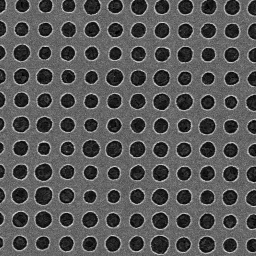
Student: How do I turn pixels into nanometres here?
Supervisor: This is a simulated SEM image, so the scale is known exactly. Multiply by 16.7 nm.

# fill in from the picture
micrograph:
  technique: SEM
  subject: a regular array of holes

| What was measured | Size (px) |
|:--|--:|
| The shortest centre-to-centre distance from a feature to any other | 23.1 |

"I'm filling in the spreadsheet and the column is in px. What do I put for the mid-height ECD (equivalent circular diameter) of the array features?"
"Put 14.8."